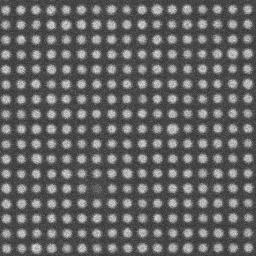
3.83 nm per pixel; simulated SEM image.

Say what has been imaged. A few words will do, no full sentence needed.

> a regular array of raised bodies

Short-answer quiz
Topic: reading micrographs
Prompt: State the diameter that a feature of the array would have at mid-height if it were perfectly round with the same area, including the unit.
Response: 31.5 nanometers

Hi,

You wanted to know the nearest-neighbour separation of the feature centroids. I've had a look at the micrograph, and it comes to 0.0565 microns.